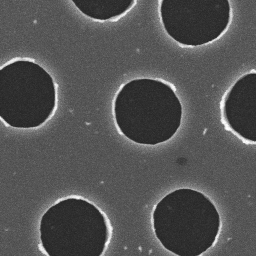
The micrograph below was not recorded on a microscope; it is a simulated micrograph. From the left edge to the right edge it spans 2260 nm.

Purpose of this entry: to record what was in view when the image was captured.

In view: holes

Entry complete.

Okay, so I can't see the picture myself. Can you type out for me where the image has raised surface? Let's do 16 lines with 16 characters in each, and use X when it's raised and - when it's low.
XXXXX---XX----XX
XXXXXXXXXX----XX
XXXXXXXXXXX--XXX
XXXXXXXXXXXXXXXX
---XXXXXXXXXXXXX
---XXXXX---XXXX-
---XXXX----XXX--
---XXXX----XXX--
XXXXXXXX---XXXX-
XXXXXXXXXXXXXXXX
XXXXXXXXXXXXXXXX
XXXXXXXXXXXXXXXX
XXXX-XXXXX---XXX
XXX---XXXX----XX
XXX----XXX----XX
XXX---XXXX---XXX